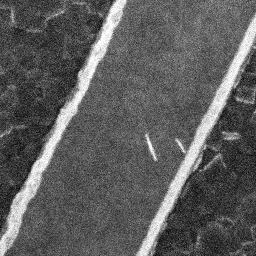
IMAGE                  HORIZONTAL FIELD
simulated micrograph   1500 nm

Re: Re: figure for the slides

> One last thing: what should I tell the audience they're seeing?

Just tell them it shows one or a few lines or trenches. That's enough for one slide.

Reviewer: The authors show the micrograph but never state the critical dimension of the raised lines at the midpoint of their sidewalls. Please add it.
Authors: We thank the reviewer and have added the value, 764 nanometers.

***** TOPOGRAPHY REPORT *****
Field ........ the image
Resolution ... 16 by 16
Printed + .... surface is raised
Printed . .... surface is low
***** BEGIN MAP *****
.......+++++++++
.......+++++++++
......++++++++++
......+++++++++.
......+++++++++.
.....+++++++++..
.....+++++++++..
....+++++++++...
....+++++++++...
...+++++++++....
..++++++++++....
..+++++++++.....
.++++++++++.....
.+++++++++......
.+++++++++......
+++++++++.......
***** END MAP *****